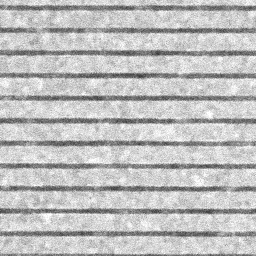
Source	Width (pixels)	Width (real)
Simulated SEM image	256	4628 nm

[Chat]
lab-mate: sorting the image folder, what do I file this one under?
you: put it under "parallel lines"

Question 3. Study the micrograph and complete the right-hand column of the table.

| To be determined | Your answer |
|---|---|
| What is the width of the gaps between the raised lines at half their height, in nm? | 104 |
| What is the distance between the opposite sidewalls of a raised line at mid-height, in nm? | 303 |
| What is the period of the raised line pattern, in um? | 0.408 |